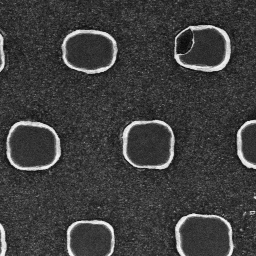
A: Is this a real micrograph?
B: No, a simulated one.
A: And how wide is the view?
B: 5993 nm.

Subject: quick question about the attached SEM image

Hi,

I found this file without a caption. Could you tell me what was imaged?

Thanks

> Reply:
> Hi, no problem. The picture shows raised bodies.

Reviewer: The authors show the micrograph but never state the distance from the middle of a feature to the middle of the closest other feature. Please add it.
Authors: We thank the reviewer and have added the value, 2590 nanometres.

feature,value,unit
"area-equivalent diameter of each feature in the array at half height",1150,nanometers